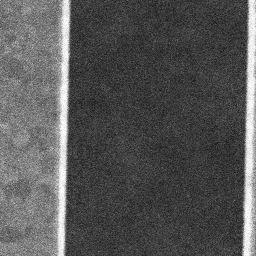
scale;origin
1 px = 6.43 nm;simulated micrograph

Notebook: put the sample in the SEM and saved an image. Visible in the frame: one or a few lines or trenches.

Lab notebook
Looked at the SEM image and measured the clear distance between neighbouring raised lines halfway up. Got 1210 nm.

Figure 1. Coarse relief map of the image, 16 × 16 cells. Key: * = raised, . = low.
****............
****............
****............
****............
****............
****............
****............
****............
****............
****............
****............
****............
****............
****............
****............
****............